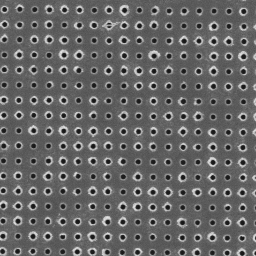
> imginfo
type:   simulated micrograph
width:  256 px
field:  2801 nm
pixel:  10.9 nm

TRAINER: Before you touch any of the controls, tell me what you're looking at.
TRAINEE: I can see a regular array of holes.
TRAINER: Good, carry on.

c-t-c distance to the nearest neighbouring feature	162	nm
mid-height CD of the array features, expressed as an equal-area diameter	57.9	nm